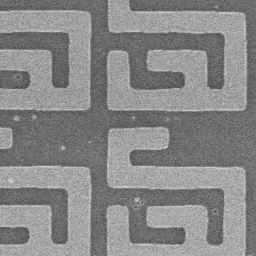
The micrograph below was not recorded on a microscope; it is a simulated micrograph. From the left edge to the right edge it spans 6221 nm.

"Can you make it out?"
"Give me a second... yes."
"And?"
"wiring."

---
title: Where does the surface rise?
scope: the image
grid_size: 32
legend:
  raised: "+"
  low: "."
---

..............++................
.+++++++++....+++...............
+++++++++++...+++++++++++++++++.
+++++++++++...+++++++++++++++++.
.........++.................+++.
.........++.................+++.
++++++...++...+....++++++...+++.
++++++...++..+++...+++++++..+++.
++++++...++..+++...+++++++..+++.
....++...++..+++.......+++..+++.
....+++..++..+++.......+++..+++.
+++++++++++..++++++++++++++++++.
+++++++++++..++++++++++++++++++.
+++++++++++...++++++++++++++++..
................................
................................
+.............+++++++...........
+.............+++++++...........
+.............+++++++...........
..............++................
.............+++................
+++++++++++..++++++++++++++++++.
+++++++++++..++++++++++++++++++.
.......++++.......+++++++..++++.
........+++.................+++.
.........++.................+++.
++++++...++..+++..++++++++..+++.
++++++...++..+++..++++++++..+++.
...+++...++..+++.......+++..+++.
....++...++..+++.......+++..+++.
...++++.+++..++++......+++..+++.
+++++++++++..++++++++++++++++++.